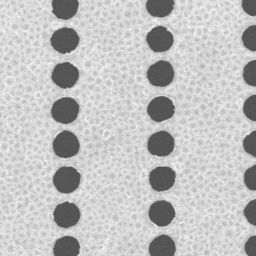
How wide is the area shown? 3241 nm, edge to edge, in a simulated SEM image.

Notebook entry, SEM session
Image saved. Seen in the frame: a regular array of holes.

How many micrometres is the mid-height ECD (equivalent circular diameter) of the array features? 0.343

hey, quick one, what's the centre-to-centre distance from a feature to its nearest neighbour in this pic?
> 0.438 micrometres